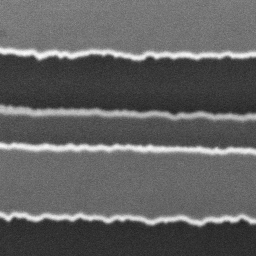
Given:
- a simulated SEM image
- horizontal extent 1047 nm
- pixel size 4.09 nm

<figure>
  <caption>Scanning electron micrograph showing lines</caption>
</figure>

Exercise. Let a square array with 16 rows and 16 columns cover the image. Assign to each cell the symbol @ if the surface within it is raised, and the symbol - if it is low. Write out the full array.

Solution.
@@@@@@@@@@@@@@@@
@@@@@@@@@@@@@@@@
@@@@@@@@@@@@@@@@
--@-@--@@@@@@@@@
----------------
----------------
----------------
----------------
----------------
@@@@@@@@@@@@@@@@
@@@@@@@@@@@@@@@@
@@@@@@@@@@@@@@@@
@@@@@@@@@@@@@@@@
@@@@@@@@@@@@@@@@
----------------
----------------